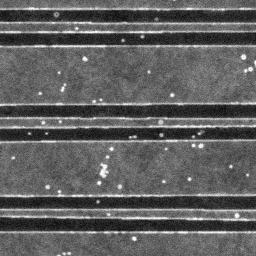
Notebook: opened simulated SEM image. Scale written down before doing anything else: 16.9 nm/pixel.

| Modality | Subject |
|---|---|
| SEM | lines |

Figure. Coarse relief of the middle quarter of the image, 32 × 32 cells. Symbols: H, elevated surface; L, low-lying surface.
HHHHHHHHHHHHHHHHHHHHHHHHHHHHHHHH
HHHHHHHHHHHHHHHHHHHHHHHHHHHHHHHH
HHHHHHHHHHHHHHHHHHHHHHHHHHHHHHHH
HHHHHHHHHHHHHHHHHHHHHHHHHHHHHHHH
HHHHHHHHHHHHHHHHHHHHHHHHHHHHHHHH
HHHHHHHHHHHHHHHHHHHHHHHHHHHHHHHH
HHHHHHHHHHHHHHHHHHHHHHHHHHHHHHHH
HHHHHHHHHHHHHHHHHHHHHHHHHHHHHHHH
HHHHHHHHHHHHHHHHHHHHHHHHHHHHHHHH
HHHHHHHHHHHHHHHHHHHHHHHHHHHHHHHH
LLLLLLLLLLLLLLLLLLLLLLLLLLLLLLLL
LLLLLLLLLLLLLLLLLLLLLLLLLLLLLLLL
LLLLLLLLLLLLLLLLLLLLLLLLLLLLLLLL
LLLLLLLLLLLLLLLLLLLLLLLLLLLLLLLL
HHHHHHHHHHHHHHHHHHHHHHHHHHHHHHHH
HHHHHHHHHHHHHHHHHHHHHHHHHHHHHHHH
LLLLLLLLLLLLLLLLLLLLLLLLLLLLLLLL
LLLLLLLLLLLLLLLLLLLLLLLLLLLLLLLL
LLLLLLLLLLLLLLLLLLLLLLLLLLLLLLLL
HHHHHHHHHHHHHHHHHHHHHHHHHHHHHHHH
HHHHHHHHHHHHHHHHHHHHHHHHHHHHHHHH
HHHHHHHHHHHHHHHHHHHHHHHHHHHHHHHH
HHHHHHHHHHHHHHHHHHHHHHHHHHHHHHHH
HHHHHHHHHHHHHHHHHHHHHHHHHHHHHHHH
HHHHHHHHHHHHHHHHHHHHHHHHHHHHHHHH
HHHHHHHHHHHHHHHHHHHHHHHHHHHHHHHH
HHHHHHHHHHHHHHHHHHHHHHHHHHHHHHHH
HHHHHHHHHHHHHHHHHHHHHHHHHHHHHHHH
HHHHHHHHHHHHHHHHHHHHHHHHHHHHHHHH
HHHHHHHHHHHHHHHHHHHHHHHHHHHHHHHH
HHHHHHHHHHHHHHHHHHHHHHHHHHHHHHHH
HHHHHHHHHHHHHHHHHHHHHHHHHHHHHHHH